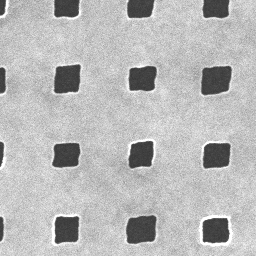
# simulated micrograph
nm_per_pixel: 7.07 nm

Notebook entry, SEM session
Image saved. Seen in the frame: a regular array of holes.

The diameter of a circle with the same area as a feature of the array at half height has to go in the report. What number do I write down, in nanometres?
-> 205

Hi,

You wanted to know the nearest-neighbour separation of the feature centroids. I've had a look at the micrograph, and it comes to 528 nanometres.